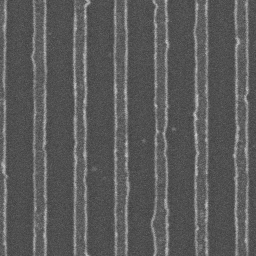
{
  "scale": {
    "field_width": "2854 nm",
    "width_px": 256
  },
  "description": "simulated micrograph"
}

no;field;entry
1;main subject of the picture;parallel lines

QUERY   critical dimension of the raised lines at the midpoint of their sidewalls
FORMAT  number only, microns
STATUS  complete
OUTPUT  0.132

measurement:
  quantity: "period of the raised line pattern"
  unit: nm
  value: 450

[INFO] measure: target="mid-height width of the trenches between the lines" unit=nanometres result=315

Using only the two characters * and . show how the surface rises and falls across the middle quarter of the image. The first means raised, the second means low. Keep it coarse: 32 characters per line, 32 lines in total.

..***........***.......***......
..***........***.......***......
...**........**........***......
...**........**........***......
...**........**........***......
...**........**........***......
...**........**........***......
...**........**........***......
...**........**........***......
...**........**........***......
...**........**........***......
...**........**........**.......
...**........***.......***......
...**........***.......***......
...**........***.......***......
...**........***.......***......
...**........***.......**.......
...**........***.......**.......
...**........***.......**.......
...**........***.......**.......
...**........***.......**.......
...**........***.......**.......
...**........***.......**.......
...**........***.......***......
...**........***.......***......
...**........***.......***......
...**........***.......***......
...**........***.......***......
...**........***.......***......
...**........***.......***......
...**........***.......***......
...**........***.......***......